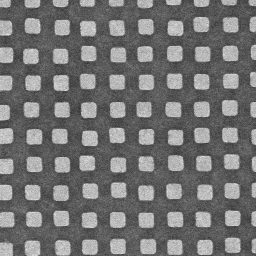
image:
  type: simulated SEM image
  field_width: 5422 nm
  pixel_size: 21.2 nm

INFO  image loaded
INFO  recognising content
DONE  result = a regular array of raised bodies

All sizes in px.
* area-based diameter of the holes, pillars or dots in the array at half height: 16.6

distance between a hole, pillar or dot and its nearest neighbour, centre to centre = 0.561 µm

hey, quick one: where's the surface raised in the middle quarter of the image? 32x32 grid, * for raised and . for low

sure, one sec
................................
................................
................................
*...****....***....***....****..
*...****....***....***....****..
*...****....***....***....****..
*...............................
................................
................................
................................
*...****....***...****....***...
*...****....***...****....***...
*...****....***...****....***...
................................
................................
................................
............***....***..........
*....***....***....***....****..
*....***....***....***....****..
*....***....***....***....****..
................................
................................
................................
*...****...........***....****..
*...****....***....***....****..
*...****....***....***....****..
*...........***....***....***...
................................
................................
................................
.....***....***...........***...
*....***....***....***....***...